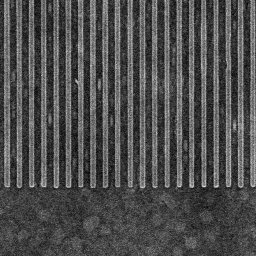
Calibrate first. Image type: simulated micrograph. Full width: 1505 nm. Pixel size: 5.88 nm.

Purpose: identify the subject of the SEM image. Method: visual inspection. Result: parallel lines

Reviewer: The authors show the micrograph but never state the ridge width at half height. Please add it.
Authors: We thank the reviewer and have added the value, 4.51 px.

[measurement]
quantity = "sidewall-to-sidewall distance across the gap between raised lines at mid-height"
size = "0.047 microns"